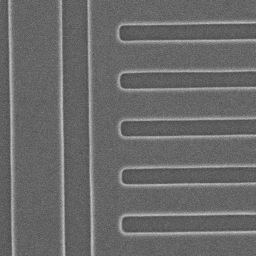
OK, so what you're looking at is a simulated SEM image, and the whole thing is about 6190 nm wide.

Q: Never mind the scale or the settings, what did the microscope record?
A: groups of lines, slits or small figures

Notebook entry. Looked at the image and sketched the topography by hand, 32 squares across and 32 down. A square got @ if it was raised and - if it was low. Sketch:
-@@@@@@@---@@@@@@@@@@@@@@@@@@@@@
-@@@@@@@---@@@@@@@@@@@@@@@@@@@@@
-@@@@@@@---@@@@@@@@@@@@@@@@@@@@@
-@@@@@@@---@@@@-----------------
-@@@@@@@---@@@@-----------------
-@@@@@@@---@@@@@@@@@@@@@@@@@@@@@
-@@@@@@@---@@@@@@@@@@@@@@@@@@@@@
-@@@@@@@---@@@@@@@@@@@@@@@@@@@@@
-@@@@@@@---@@@@@@@@@@@@@@@@@@@@@
-@@@@@@@---@@@@-----------------
-@@@@@@@---@@@@-----------------
-@@@@@@@---@@@@@@@@@@@@@@@@@@@@@
-@@@@@@@---@@@@@@@@@@@@@@@@@@@@@
-@@@@@@@---@@@@@@@@@@@@@@@@@@@@@
-@@@@@@@---@@@@@@@@@@@@@@@@@@@@@
-@@@@@@@---@@@@-----------------
-@@@@@@@---@@@@-----------------
-@@@@@@@---@@@@@@@@@@@@@@@@@@@@@
-@@@@@@@---@@@@@@@@@@@@@@@@@@@@@
-@@@@@@@---@@@@@@@@@@@@@@@@@@@@@
-@@@@@@@---@@@@@@@@@@@@@@@@@@@@@
-@@@@@@@---@@@@-----------------
--@@@@@@---@@@@-----------------
--@@@@@@---@@@@@@@@@@@@@@@@@@@@@
--@@@@@@---@@@@@@@@@@@@@@@@@@@@@
--@@@@@@---@@@@@@@@@@@@@@@@@@@@@
--@@@@@@---@@@@@@@@@@@@@@@@@@@@@
--@@@@@@---@@@@-----------------
--@@@@@@---@@@@-----------------
--@@@@@@---@@@@@@@@@@@@@@@@@@@@@
--@@@@@@---@@@@@@@@@@@@@@@@@@@@@
--@@@@@@---@@@@@@@@@@@@@@@@@@@@@